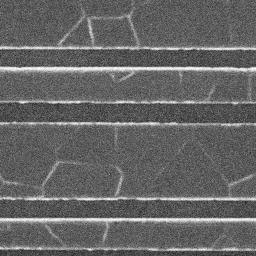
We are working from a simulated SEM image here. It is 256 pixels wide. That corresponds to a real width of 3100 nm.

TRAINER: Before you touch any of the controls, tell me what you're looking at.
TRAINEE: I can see lines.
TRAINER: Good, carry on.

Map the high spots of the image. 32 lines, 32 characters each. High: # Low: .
################################
################################
################################
################################
################################
################################
................................
................................
##.##..#..##.#############......
################################
################################
################################
################################
................................
................................
####################.#..........
################################
################################
################################
################################
################################
################################
################################
################################
################################
................................
................................
################################
################################
################################
################################
................................